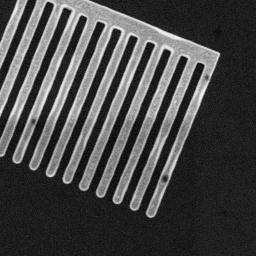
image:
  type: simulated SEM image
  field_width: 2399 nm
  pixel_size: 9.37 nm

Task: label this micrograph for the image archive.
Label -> groups of lines, slits or small figures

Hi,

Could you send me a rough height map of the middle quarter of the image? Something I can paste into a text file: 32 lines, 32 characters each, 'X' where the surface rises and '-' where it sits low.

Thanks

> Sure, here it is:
--XX--XXX--XX---XX---XX--XXX--XX
-XX---XX---XX---XX--XXX--XXX--XX
-XX--XXX--XXX--XX---XX---XX---XX
XXX--XX---XX---XX---XX--XXX--XXX
XX---XX---XX--XXX--XXX--XX---XX-
X---XX---XX---XX---XX---XX---XX-
X---XX--XXX---XX--XXX--XX---XX--
X--XXX--XXX--XX---XX---XX--XXX--
---XX---XX---XX--XXX--XXX--XXX--
---XX--XXX--XXX--XXX--XX---XX---
--XXX--XX---XX---XX---XX--XXX--X
--XX---XX--XXX--XXX--XXX--XXX--X
-XXX--XX---XX---XX---XX---XX---X
-XX---XX---XX--XXX--XXX--XXX--XX
-XX--XXX--XXX--XX---XX---XX---XX
XXX--XX---XX---XX---XX--XXX--XXX
XX---XX---XX--XXX--XXX--XXX--XX-
XX--XX---XX---XX---XX---XX---XX-
X---XX---XX--XXX--XXX---X---XX--
X--XXX--XXX--XX---XX---XX---XX--
---XX---XX---XX---XX---X---XXX--
---XX--XXX--XXX--XXX--XX---XX---
--XXX--XXX--XX---XX---XX---XX---
--XX--XXX--XXX--XXX--XX---XX----
-XXX--XXX--XX---XX---XX---XX----
-XX---XX---XX---XX--XXX--XX-----
XXX--XXX--XXX--XX---XX---XX-----
XXX--XXX--XX---XX---XX--XXX-----
XX---XX---XX--XXX--XXX--XX------
X---XXX--XX---XX---XX---XX------
----XX---XX--XXX--XXX--XXX------
--------XXX--XX---XX---XX-------